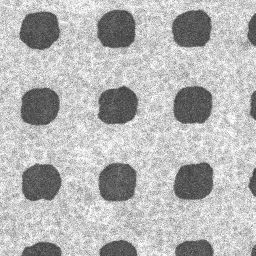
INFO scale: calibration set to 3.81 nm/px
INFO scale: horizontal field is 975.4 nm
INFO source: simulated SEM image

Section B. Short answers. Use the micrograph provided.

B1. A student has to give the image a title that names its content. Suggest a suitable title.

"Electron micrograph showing a regular array of holes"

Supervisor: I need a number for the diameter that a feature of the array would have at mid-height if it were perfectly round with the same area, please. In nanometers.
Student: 151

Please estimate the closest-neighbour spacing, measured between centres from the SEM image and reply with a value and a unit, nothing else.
290 nm